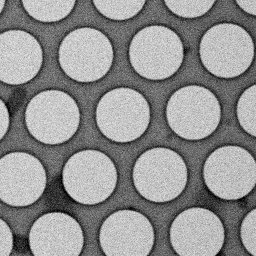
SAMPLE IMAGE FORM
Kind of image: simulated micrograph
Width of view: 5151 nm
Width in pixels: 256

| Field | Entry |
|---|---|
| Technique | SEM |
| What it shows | an array of small figures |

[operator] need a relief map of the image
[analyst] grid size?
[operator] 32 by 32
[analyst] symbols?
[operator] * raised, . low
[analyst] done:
...******...******...******...**
...******....****.....****.....*
.....**.........................
..................***.....****..
****....*****....*****...******.
*****...******..*******..*******
*****..*******..*******..*******
*****..*******..*******..******.
*****...******...*****....*****.
****.....****.....***......***..
................................
.....***......***.....****.....*
....*****....*****...******...**
*..*******..*******..******...**
*..*******..*******..******...**
*..*******..*******..******...**
*...*****....*****....*****....*
.....***......***...............
............................**..
.***.....****.....****....*****.
*****...******...******...******
******..*******..******..*******
******..*******..******...******
******..******...******...******
*****....*****....****.....***..
.***............................
...............**......***.....*
.....****....*****....*****....*
*...******...******..*******..**
**..******..*******..*******..**
**..******...******..*******..**
*...******...******...*****....*